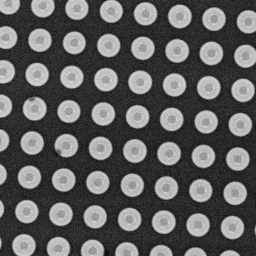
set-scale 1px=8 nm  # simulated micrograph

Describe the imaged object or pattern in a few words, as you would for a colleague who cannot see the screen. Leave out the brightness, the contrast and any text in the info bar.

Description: an array of small figures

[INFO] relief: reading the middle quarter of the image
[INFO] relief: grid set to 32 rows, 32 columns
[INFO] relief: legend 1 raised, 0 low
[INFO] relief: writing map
01000000000000000000000000000000
11110000011100000000000000000000
11111000111110000111100000010000
11111000111110001111110001111100
11110000111110001111110001111100
11110000111110001111110001111100
00000000011100000111100001111100
00000000000000000000000000111000
00000000000000000000000000000000
11100000000000000000000000000000
11110000111100000110000000000000
11110001111110001111100001111000
11110001111110001111100011111000
11100001111100001111100011111100
11000000111100001111100011111100
00000000000000000111000001111000
00000000000000000000000000110000
00000000000000000000000000000000
11100000110000000000000000000000
11100001111100001111000000000000
11100011111100011111000011110000
11100011111100011111100011111000
11100001111100011111100111111000
00000000111000011111000011111000
00000000000000000110000011110000
00000000000000000000000000000000
10000000000000000000000000000000
11000001110000000000000000000000
11100011111000011110000011100000
11100011111000111111000111110000
11000011111000111111000111110000
10000011111000011111000111110001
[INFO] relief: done